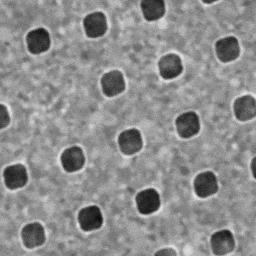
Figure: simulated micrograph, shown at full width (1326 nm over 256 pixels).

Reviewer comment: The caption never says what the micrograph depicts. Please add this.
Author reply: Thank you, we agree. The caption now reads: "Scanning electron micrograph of a regular array of holes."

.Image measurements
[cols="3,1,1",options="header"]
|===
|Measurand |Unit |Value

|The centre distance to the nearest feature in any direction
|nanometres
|310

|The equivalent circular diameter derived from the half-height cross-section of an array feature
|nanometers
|143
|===